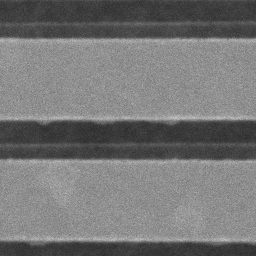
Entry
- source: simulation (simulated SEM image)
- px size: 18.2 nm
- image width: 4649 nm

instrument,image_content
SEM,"lines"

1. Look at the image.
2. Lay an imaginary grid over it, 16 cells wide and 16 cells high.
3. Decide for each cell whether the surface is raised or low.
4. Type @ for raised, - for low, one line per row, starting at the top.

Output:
----------------
----------------
@@@@@@@@@@@@@@@@
@@@@@@@@@@@@@@@@
@@@@@@@@@@@@@@@@
@@@@@@@@@@@@@@@@
@@@@@@@@@@@@@@@@
----------------
----------------
----------------
@@@@@@@@@@@@@@@@
@@@@@@@@@@@@@@@@
@@@@@@@@@@@@@@@@
@@@@@@@@@@@@@@@@
@@@@@@@@@@@@@@@@
----------------